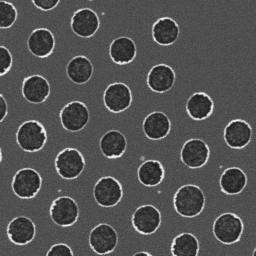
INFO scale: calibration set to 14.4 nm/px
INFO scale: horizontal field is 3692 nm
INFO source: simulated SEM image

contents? a regular array of holes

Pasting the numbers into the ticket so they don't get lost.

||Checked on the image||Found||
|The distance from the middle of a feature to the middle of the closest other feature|676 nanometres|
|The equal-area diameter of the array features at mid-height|376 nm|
